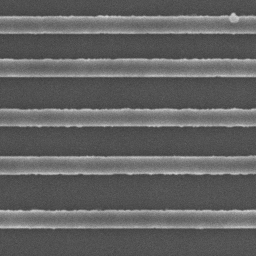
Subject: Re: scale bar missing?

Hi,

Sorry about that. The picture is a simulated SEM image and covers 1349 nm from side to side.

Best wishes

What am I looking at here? lines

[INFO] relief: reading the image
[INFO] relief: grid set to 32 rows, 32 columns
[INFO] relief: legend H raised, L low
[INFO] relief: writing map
LLLLLLLLLLLLLLLLLLLLLLLLLLLLLLLL
LLLLLLLLLLLLLLLLLLLLLLLLLLLLLLLL
HHHHHHHHHHHHHHHHHHHHHHHHHHHHHHHH
HHHHHHHHHHHHHHHHHHHHHHHHHHHHHHHH
LLLLLLLLLLLLLLLLLLLLLLLLLLLLLLLL
LLLLLLLLLLLLLLLLLLLLLLLLLLLLLLLL
LLLLLLLLLLLLLLLLLLLLLLLLLLLLLLLL
HHLHLHHHHHHHHHHHHHHHHLLHHHHHHHLH
HHHHHHHHHHHHHHHHHHHHHHHHHHHHHHHH
HHHHHHHHHHHHHHHHHHHHHHHHHHHHHHHH
LLLLLLLLLLLLLLLLLLLLLLLLLLLLLLLL
LLLLLLLLLLLLLLLLLLLLLLLLLLLLLLLL
LLLLLLLLLLLLLLLLLLLLLLLLLLLLLLLL
LLLLLLLLLLLLLLLLLLLLLLLLLLLLLLLL
HHHHHHHHHHHHHHHHHHHHHHHHHHHHHHHH
HHHHHHHHHHHHHHHHHHHHHHHHHHHHHHHH
LLLLLLLLLLLLLLLLLLLLLLLLLLLLLLLL
LLLLLLLLLLLLLLLLLLLLLLLLLLLLLLLL
LLLLLLLLLLLLLLLLLLLLLLLLLLLLLLLL
LLLLLLLLLLLLLLLLLLLLLLLLLLLLLLLL
HHHHHHHHHHHHHHHHHHHHHHHHHHHHHHHH
HHHHHHHHHHHHHHHHHHHHHHHHHHHHHHHH
LLLLLLLLLLLLLLLLLLLLLLLLLLLLLLLL
LLLLLLLLLLLLLLLLLLLLLLLLLLLLLLLL
LLLLLLLLLLLLLLLLLLLLLLLLLLLLLLLL
LLLLLLLLLLLLLLLLLLLLLLLLLLLLLLLL
HHHHHHHHHHHHHHHHHHHHHHHHHHHHHHHH
HHHHHHHHHHHHHHHHHHHHHHHHHHHHHHHH
LLLHLLLLLLLLLLLLLLLLLLLLLHLLLLLL
LLLLLLLLLLLLLLLLLLLLLLLLLLLLLLLL
LLLLLLLLLLLLLLLLLLLLLLLLLLLLLLLL
LLLLLLLLLLLLLLLLLLLLLLLLLLLLLLLL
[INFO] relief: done